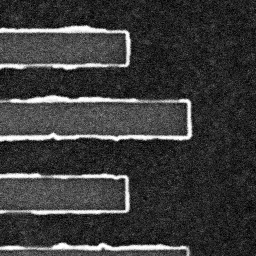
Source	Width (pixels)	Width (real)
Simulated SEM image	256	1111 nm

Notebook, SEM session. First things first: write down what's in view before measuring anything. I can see one or a few lines or trenches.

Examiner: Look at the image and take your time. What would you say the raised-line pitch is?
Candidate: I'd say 318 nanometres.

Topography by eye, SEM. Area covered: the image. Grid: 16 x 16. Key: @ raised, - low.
@@@@@@@@@@@@@@@@
@@@@@@@@@@@@@@@@
--------@@@@@@@@
--------@@@@@@@@
@@@@@@@@@@@@@@@@
@@@@@@@@@@@@@@@@
-----------@@@@@
------------@@@@
--@@@@@-@--@@@@@
@@@@@@@@@@@@@@@@
@@@@@@@@@@@@@@@@
--------@@@@@@@@
--------@@@@@@@@
@@@@@@@@@@@@@@@@
@@@@@@@@@@@@@@@@
@@@@@@@@@@@@@@@@